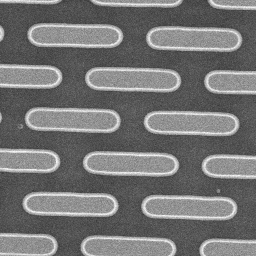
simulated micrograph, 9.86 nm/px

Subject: groups of lines, slits or small figures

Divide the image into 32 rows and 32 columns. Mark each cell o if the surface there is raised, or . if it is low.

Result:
............oooooooooo.....ooooo
................................
................................
....oooooooooo......ooo.........
....ooooooooooo....ooooooooooo..
.....oooooooooo....ooooooooooo..
................................
................................
ooooooo.........................
oooooooo...ooooooooooo....oooooo
ooooooo....ooooooooooo....oooooo
...........................ooooo
................................
................................
...oooooooooooo....oooooooooo...
....ooooooooooo...oooooooooooo..
...................oooooooooo...
................................
................................
ooooooo....oooooooooo...........
ooooooo....ooooooooooo...ooooooo
............oooooooooo....oooooo
................................
................................
....oooooooooo..................
...ooooooooooo....ooooooooooo...
....oooooooooo....ooooooooooo...
................................
................................
oooooo..........................
ooooooo...oooooooooooo...ooooooo
ooooooo....ooooooooooo...ooooooo